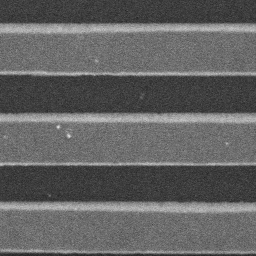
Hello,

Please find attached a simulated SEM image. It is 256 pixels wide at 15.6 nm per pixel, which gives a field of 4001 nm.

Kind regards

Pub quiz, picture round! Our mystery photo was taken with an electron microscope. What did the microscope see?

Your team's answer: lines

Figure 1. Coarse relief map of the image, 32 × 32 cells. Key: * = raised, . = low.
................................
................................
................................
********************************
********************************
********************************
********************************
********************************
********************************
................................
................................
................................
................................
................................
***************.****.**.***.***.
********************************
********************************
********************************
********************************
********************************
****************.***************
................................
................................
................................
................................
................................
********************************
********************************
********************************
********************************
********************************
.....***************************